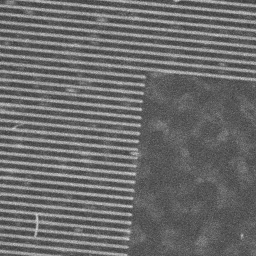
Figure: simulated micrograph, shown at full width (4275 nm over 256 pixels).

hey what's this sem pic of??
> parallel lines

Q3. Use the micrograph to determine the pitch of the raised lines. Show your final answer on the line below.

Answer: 0.136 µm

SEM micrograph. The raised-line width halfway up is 43.7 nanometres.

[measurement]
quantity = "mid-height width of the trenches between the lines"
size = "91.5 nm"